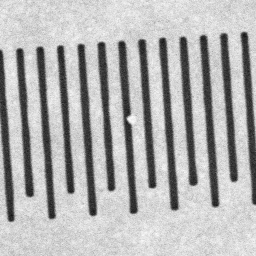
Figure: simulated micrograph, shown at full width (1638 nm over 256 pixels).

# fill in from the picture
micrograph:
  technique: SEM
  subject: groups of lines, slits or small figures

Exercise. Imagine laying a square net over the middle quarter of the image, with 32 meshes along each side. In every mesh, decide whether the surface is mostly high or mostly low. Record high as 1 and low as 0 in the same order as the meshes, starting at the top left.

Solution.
11100011000111001110011100111001
11100011000111001110011100111001
01110011100111001110011100111001
01110011100111001110011100111000
01110011100111001110011100111000
01110011100111001110001100011000
01110011100111000110001110011000
01110011100111000110001110011000
01110011100111000110001110011100
01110011100111000110001110011100
01110011100111000110001110011100
01110001100111000111001110011100
01110001110111100111001110011100
01110001110111101111001110011100
01110001110011101111001110011100
00111001110011100111001110011100
00111001110011100111001110001100
00111001110011100111001110001100
00111001110011100111001110001100
00111001110011100111001110001110
00111001110011100111001110001110
00111001110011100111001110001110
00111001110011100111000111001110
00111001110011100011000111001110
00111001110001100011100111001110
00111000110001110011100111001110
00011000111001110011100111001110
00011000111001110011100111001110
00011000111001110011100111001110
00011000111001110011100111001110
00011000111001110011100111001111
10011100111001110011111111001111